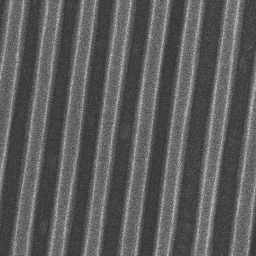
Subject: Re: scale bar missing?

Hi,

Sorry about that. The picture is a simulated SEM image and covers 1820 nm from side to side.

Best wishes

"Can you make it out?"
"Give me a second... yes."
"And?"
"parallel lines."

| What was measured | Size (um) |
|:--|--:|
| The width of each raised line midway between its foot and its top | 0.124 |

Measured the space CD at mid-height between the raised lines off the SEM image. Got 130 nanometres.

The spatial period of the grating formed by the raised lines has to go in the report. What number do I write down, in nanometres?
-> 254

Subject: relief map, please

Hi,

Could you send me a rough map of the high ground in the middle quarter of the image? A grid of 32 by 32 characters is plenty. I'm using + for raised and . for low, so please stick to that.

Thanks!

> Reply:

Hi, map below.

..++++.....++++.....++++....++++
..++++.....++++.....++++....++++
..++++....+++++.....++++....++++
..++++....+++++.....++++....++++
..++++....+++++....+++++....++++
.++++.....++++.....+++++....++++
.++++.....++++.....++++.....++++
.++++.....++++.....++++.....++++
.++++.....++++.....++++....+++++
.++++.....++++.....++++....+++++
.++++.....++++....+++++....++++.
.++++....+++++....+++++....++++.
.++++....++++.....+++++....++++.
+++++....++++.....+++++....++++.
+++++....++++.....++++.....++++.
++++.....++++.....++++.....++++.
++++.....++++.....++++....++++..
++++....+++++.....++++....++++..
++++....+++++.....++++....++++..
++++....++++.....+++++....++++..
++++....++++.....+++++....++++..
++++....++++.....+++++....++++..
++++....++++.....+++++....++++..
++++....++++.....++++.....++++..
+++.....++++.....++++....++++...
+++....+++++.....++++....++++...
+++....+++++.....++++....++++...
+++....++++.....+++++....++++...
+++....++++.....+++++....++++...
+++....++++.....++++.....++++...
+++....++++.....++++.....++++...
+++....++++.....++++....+++++...